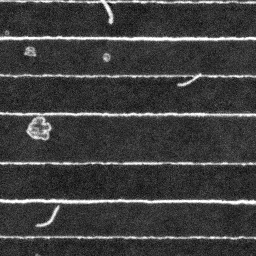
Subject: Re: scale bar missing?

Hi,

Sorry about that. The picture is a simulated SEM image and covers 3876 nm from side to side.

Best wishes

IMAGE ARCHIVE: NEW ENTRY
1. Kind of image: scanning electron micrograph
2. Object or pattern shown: lines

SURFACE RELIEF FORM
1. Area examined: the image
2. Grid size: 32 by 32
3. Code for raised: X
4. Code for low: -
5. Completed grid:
-------------X------------------
--------------------------------
--------------------------------
--------------------------------
--------------------------------
XXXXXXXXXXXXXXXXXXXXXXXXXXXXXXXX
XXXXXXXXXXXXXXXXXXXXXXXXXXXXXXXX
XXXXXXXXXXXXXXXXXXXXXXXXXXXXXXXX
XXXXXXXXXXXXXXXXXXXXXXXXXXXXXXXX
-XX-----XXXXXXX-X-XXXX-XX-XXXXXX
--------------------------------
--------------------------------
--------------------------------
--------------------------------
XXXXXXXXXXXXXXXXXXXXXXXXXXXXXXXX
XXXXXXXXXXXXXXXXXXXXXXXXXXXXXXXX
XXXXXXXXXXXXXXXXXXXXXXXXXXXXXXXX
XXXXXXXXXXXXXXXXXXXXXXXXXXXXXXXX
XXXXXXXXXXXXXXXXXXXXXXXXXXXXXXXX
XXXXXXXXXXXXXXXXXXXXXXXXXXXXXXXX
-------------------------X----X-
--------------------------------
--------------------------------
--------------------------------
--------------------------------
XXXXXXXXXXXXXXXXXXXXXXXXXXXXXXXX
XXXXXXXXXXXXXXXXXXXXXXXXXXXXXXXX
XXXXXXXXXXXXXXXXXXXXXXXXXXXXXXXX
XXXXXXXXXXXXXXXXXXXXXXXXXXXXXXXX
XXXXXXXXXXXXXXXXXXXXXXXXXXXXXXXX
--------------------------------
--------------------------------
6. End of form